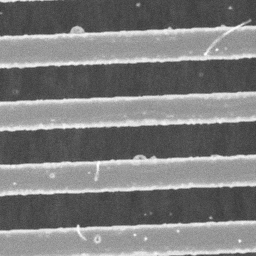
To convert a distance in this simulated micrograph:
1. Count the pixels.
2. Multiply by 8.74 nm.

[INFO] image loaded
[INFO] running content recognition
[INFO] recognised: lines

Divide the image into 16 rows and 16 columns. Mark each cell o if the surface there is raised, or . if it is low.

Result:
................
................
oooooooooooooooo
oooooooooooooooo
................
................
oooooooooooooooo
oooooooooooooooo
................
................
oooooooooooooooo
oooooooooooooooo
................
................
oooooooooooooooo
oooooooooooooooo